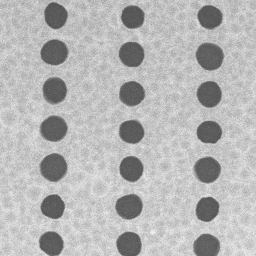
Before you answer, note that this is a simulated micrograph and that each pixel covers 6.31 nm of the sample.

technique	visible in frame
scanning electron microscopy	a regular array of holes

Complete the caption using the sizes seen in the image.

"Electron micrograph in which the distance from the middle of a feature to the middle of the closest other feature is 236 nanometres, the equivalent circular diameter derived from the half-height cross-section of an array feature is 157 nanometers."